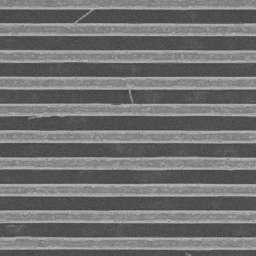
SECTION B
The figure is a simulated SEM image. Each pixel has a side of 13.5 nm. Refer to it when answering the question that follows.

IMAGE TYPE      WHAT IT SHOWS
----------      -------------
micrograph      parallel lines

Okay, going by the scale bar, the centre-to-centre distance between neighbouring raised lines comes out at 0.36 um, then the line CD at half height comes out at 0.148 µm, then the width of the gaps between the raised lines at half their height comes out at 0.217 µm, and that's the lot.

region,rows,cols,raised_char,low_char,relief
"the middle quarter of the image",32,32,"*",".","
................................
................................
................................
................................
********************************
********************************
................*...............
................................
................................
................................
************..******************
********************************
********************************
................................
................................
................................
................................
********************************
********************************
................................
................................
................................
................................
................................
********************************
********************************
................................
................................
................................
................................
**********....******************
********************************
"